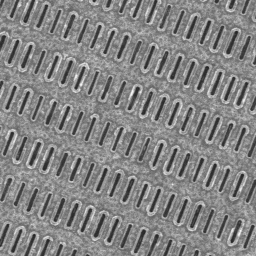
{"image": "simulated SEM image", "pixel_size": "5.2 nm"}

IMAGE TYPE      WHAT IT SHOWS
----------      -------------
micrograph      a regular array of holes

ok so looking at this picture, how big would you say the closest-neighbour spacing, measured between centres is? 73.3 nanometers